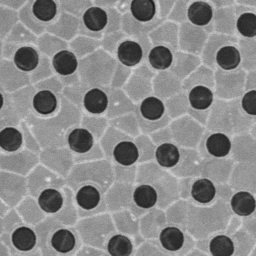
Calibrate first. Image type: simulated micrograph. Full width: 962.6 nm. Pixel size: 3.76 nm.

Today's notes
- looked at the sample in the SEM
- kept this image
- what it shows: a regular array of holes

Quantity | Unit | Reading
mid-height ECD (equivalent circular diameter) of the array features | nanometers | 93.8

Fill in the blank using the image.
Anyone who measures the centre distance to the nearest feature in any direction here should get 0.16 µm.